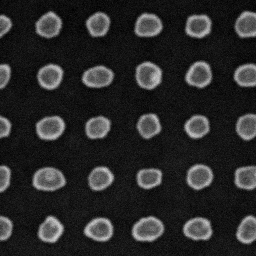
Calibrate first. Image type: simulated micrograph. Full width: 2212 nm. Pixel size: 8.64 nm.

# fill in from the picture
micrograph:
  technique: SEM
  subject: a regular array of raised bodies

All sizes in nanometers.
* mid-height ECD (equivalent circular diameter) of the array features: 199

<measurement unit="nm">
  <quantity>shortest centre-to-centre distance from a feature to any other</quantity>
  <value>424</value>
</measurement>